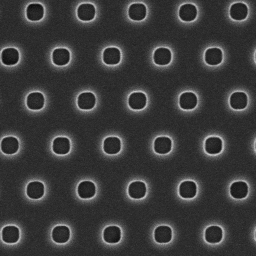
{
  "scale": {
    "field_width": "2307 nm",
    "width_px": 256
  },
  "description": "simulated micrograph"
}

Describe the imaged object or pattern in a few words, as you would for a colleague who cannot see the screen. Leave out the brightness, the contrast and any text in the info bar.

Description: a regular array of holes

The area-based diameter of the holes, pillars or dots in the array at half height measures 171 nanometres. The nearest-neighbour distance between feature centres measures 454 nanometres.